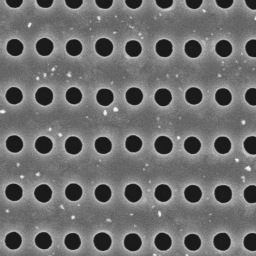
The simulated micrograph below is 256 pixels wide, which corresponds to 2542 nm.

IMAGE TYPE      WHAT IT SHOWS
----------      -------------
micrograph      a regular array of holes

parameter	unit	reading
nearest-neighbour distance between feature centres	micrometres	0.294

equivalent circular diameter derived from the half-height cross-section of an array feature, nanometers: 176